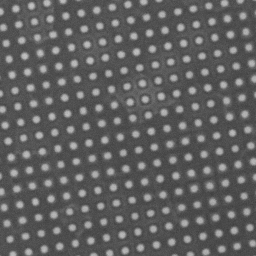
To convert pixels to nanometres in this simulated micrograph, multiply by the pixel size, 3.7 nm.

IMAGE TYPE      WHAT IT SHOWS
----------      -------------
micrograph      a regular array of raised bodies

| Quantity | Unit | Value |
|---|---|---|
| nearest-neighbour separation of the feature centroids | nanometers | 58.2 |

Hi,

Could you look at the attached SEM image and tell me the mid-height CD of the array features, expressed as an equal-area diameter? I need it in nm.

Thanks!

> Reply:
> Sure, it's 25.4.